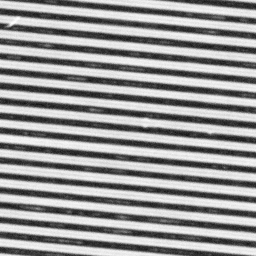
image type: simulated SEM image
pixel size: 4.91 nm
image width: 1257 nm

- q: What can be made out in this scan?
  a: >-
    parallel lines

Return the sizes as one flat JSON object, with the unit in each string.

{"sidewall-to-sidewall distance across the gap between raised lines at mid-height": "0.0416 um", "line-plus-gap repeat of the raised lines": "72.8 nanometres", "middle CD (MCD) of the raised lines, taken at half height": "28.1 nm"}